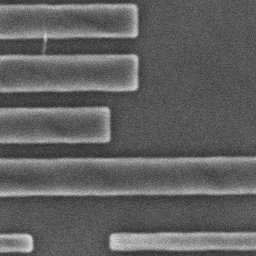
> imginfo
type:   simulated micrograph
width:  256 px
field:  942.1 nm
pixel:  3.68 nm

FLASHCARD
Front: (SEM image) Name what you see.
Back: wiring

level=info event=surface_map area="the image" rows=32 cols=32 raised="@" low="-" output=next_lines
--------------------------------
@@@@@@@@@@@@@@@@@---------------
@@@@@@@@@@@@@@@@@---------------
@@@@@@@@@@@@@-@@@---------------
@@@@@@@@@@@@@@@@@---------------
--------------------------------
--------------------------------
@@@@@@@@@@@@@@@@@---------------
@@@@@@@@@@@@@@@@@---------------
@@@@@@@@@@@@@@@@@---------------
@@@@@@@@@@@@@@@@@---------------
--------------------------------
--------------------------------
-------@--@@@-------------------
@@@@@@@@@@@@@@------------------
@@@@@@@@@@@@@@------------------
@@@@@@@@@@@@@@------------------
@@@@@@@@@@@@@@------------------
--------------------------------
--------------------------------
@@@@@@@@@@@@@@@@@@@@@@@@@@@@@@@@
@@@@@@@@@@@@@@@@@@@@@@@@@@@@@@@@
@@@@@@@@@@@@@@@@@@@@@@@@@@@@@@@@
@@@@@@@@@@@@@@@@@@@@@@@@@@@@@@@@
--------------------------------
--------------------------------
--------------------------------
--------------------------------
--------------------------------
@@@@----------@@@@@@@@@@@@@@@@@@
@@@@----------@@@@@@@@@@@@@@@@@@
--------------------------------